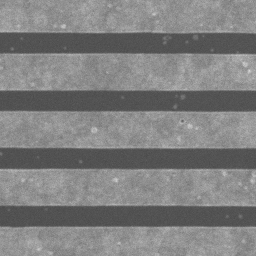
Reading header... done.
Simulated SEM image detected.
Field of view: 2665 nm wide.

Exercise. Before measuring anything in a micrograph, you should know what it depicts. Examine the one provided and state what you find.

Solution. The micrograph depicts wiring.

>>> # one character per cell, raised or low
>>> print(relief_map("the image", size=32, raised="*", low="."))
********************************
********************************
********************************
********************************
................................
................................
................................
********************************
********************************
********************************
********************************
................................
................................
................................
********************************
********************************
********************************
********************************
................................
................................
................................
********************************
********************************
********************************
********************************
********************************
................................
................................
*..******.*****************...**
********************************
********************************
********************************